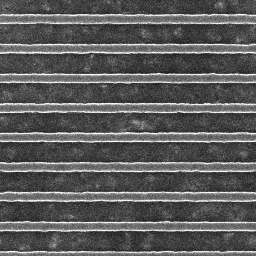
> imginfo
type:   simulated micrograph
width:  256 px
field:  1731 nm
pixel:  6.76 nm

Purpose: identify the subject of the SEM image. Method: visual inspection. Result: parallel lines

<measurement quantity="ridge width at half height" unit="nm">59.1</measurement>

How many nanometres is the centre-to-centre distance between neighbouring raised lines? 200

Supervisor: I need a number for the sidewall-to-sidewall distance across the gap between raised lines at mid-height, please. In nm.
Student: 144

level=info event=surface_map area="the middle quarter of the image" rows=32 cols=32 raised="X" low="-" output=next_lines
--------------------------------
--------------------------------
--------------------------------
XXXXXXXXXXXXXXXXXXXXXXXXXXXXXXXX
XXXXXXXXXXXXXXXXXXXXXXXXXXXXXXXX
--------------------------------
--------------------------------
--------------------------------
--------------------------------
--------------------------------
XXXXXXXXXXXXXXXXXXXXXXXXXXXXXXXX
XXXXXXXXXXXXXXXXXXXXXXXXXXXXXXXX
--------------------------------
--------------------------------
--------------------------------
-------------------X------------
--------------------------------
XXXXXXXXXXXXXXXXXXXXXXXXXXXXXXXX
XXXXXXXXXXXXXXXXXXXXXXXXXXXXXXXX
--------------------------------
--------------------------------
--------------------------------
--------------------------------
--------------------------------
--------------------------------
XXXXXXXXXXXXXXXXXXXXXXXXXXXXXXXX
XXXXXXXXXXXXXXXXXXXXXXXXXXXXXXXX
--------------------------------
--------------------------------
--------------------------------
--------------------------------
--------------------------------